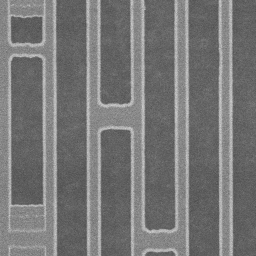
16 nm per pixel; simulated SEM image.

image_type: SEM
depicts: parallel lines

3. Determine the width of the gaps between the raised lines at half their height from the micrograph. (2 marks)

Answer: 535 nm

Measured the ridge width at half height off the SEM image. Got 174 nm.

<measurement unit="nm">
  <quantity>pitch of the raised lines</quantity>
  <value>703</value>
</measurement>